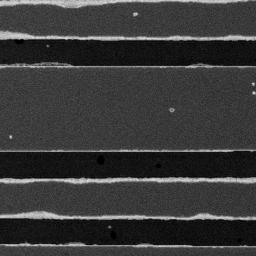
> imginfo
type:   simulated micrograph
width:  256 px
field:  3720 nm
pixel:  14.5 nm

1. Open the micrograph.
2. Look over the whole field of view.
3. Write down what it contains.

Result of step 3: lines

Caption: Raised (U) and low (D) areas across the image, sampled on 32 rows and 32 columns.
UUUUUUUUUUUUUUUUUUUUUUUUUUUUUUUU
UUUUUUUUUUUUUUUUUUUUUUUUUUUUUUUU
UUUUUUUUUUUUUUUUUUUUUUUUUUUUUUUU
UUUUUUUUUUUUUUUUUUUUUUUUUUUUUUUU
UUUUUUUUUUUUUUUUUUUUUUUUUUUUUUUU
DDDDDDDDDDDDDDDDDDDDDDDDDDDDDDDD
DDDDDDDDDDDDDDDDDDDDDDDDDDDDDDDD
DDDDDDDDDDDDDDDDDDDDDDDDDDDDDDDD
UUUUUUUUUUUUUUUUUUUUUUUUUUUUUUUU
UUUUUUUUUUUUUUUUUUUUUUUUUUUUUUUU
UUUUUUUUUUUUUUUUUUUUUUUUUUUUUUUU
UUUUUUUUUUUUUUUUUUUUUUUUUUUUUUUU
UUUUUUUUUUUUUUUUUUUUUUUUUUUUUUUU
UUUUUUUUUUUUUUUUUUUUUUUUUUUUUUUU
UUUUUUUUUUUUUUUUUUUUUUUUUUUUUUUU
UUUUUUUUUUUUUUUUUUUUUUUUUUUUUUUU
UUUUUUUUUUUUUUUUUUUUUUUUUUUUUUUU
UUUUUUUUUUUUUUUUUUUUUUUUUUUUUUUU
UUUUUUUUUUUUUUUUUUUUUUUUUUUUUUUU
DDDDDDDDDDDDDDDDDDDDDDDDDDDDDDDD
DDDDDDDDDDDDDDDDDDDDDDDDDDDDDDDD
DDDDDDDDDDDDDDDDDDDDDDDDDDDDDDDD
DDDDUUUUDDDDDUUUUUUUUUUUUUUUUUDU
UUUUUUUUUUUUUUUUUUUUUUUUUUUUUUUU
UUUUUUUUUUUUUUUUUUUUUUUUUUUUUUUU
UUUUUUUUUUUUUUUUUUUUUUUUUUUUUUUU
UUUUUUUUUUUUUUUUUUUUUUUUUUUUUUUU
DDDDDDDDDDDDDDDDDDDDDDDDDDDDDDDD
DDDDDDDDDDDDDDDDDDDDDDDDDDDDDDDD
DDDDDDDDDDDDDDDDDDDDDDDDDDDDDDDD
DDDDDDDDDDDDDDDDDDDDDDDDDDDDDDDD
UUUUUUUUUUUUUUUUUUUUUUUUUUUUUUUU